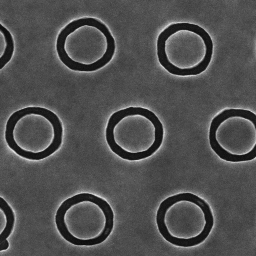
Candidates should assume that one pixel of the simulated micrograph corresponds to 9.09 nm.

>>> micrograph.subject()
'ring-shaped grooves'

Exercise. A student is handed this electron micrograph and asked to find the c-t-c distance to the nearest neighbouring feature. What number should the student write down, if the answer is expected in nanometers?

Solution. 909